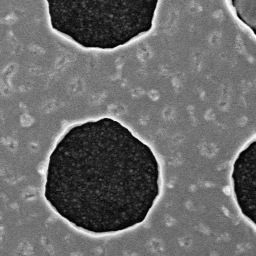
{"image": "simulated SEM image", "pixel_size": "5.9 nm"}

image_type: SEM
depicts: holes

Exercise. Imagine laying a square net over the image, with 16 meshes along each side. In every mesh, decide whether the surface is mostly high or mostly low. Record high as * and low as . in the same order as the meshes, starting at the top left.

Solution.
***.......*****.
***......******.
*****...********
****************
****************
****************
****************
******.*********
****....********
***......******.
***.......*****.
***.......*****.
***.......*****.
****.....******.
******.*********
****************